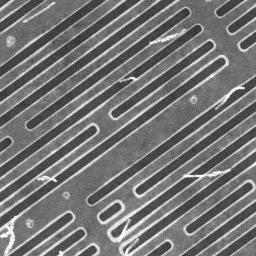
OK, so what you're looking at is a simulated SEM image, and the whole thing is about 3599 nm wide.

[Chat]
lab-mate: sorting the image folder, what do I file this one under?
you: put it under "groups of lines, slits or small figures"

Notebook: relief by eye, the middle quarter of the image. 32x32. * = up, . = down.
*....*****....*****....****....*
....****.....****....*****....**
...****....*****....****....****
.*****....****....*****....****.
****.....****....****.....****..
***....*****....****....*****...
**....****....*****....*****....
....*****....*****....****....**
...****.....****....*****....***
..****....*****....****....*****
****.....****.....****....******
***.....****....****.....*******
**....*****....****....*********
*....*******.*****....**********
....************.....***********
..****..*******....***********..
.****...******....***********...
****....****....************....
**.....****....***********....**
*....*****....***********....***
....****....************...*****
..*****....***********....*****.
.****.....***********....****...
****....***********....*****....
**.....***********....*****....*
*.....***********....****....***
....***********....*****....****
...***********....****.....****.
.***********.....****....*****..
***********....*****....****....
**********....****.....****....*
********.....****....*****....**